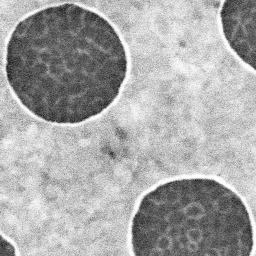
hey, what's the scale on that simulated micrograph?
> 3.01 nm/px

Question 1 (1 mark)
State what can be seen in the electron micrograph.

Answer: holes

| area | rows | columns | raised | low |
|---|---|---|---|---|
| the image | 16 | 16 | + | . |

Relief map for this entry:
+++..+++++++++..
+......+++++++..
+.......++++++..
........+++++++.
........++++++++
+.......++++++++
+......+++++++++
+++..+++++++++++
++++++++++++++++
++++++++++++++++
++++++++++++++++
++++++++++....++
+++++++++......+
++++++++........
++++++++........
.+++++++........